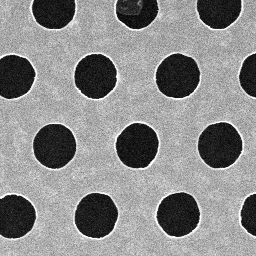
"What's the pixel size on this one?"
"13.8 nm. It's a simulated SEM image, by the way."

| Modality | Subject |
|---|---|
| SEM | holes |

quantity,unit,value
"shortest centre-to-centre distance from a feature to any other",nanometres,1110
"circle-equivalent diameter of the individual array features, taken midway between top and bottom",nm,612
